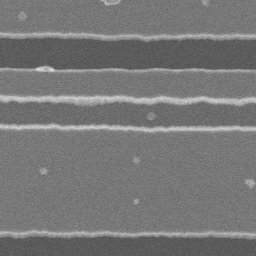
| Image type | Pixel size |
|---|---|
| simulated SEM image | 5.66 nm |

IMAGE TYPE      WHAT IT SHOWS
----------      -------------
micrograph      lines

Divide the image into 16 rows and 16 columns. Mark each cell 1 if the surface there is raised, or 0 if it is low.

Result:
1111111111111111
1111111111111111
0000000000000000
0000000000000000
1111111111111111
1111111111111111
1111111111111111
1111111111111111
1111111111111111
1111111111111111
1111111111111111
1111111111111111
1111111111111111
1111111111111111
1111111111111111
0000000000000000